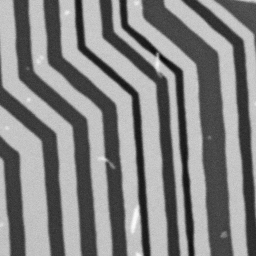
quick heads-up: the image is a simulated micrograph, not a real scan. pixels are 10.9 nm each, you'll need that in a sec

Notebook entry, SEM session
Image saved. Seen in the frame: groups of lines, slits or small figures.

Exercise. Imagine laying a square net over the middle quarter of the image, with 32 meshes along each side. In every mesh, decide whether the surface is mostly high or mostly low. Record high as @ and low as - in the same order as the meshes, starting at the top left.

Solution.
--@@@@@@---@@@@@@@----@@@---@@@@
----@@@@@---@@@@@@@----@@@@---@@
-----@@@@@---@@@@@@@----@@@---@@
------@@@@@@---@@@@@@-----@@--@@
@------@@@@@@---@@@@@@----@@--@@
@@------@@@@@@---@@@@@@---@@--@@
@@@------@@@@@@---@@@@@---@@--@@
@@@@------@@@@@@---@@@@---@@--@@
@@@@@@------@@@@@--@@@@---@@--@@
-@@@@@@-----@@@@@--@@@@---@@--@@
--@@@@@@-----@@@@--@@@@---@@--@@
---@@@@@@----@@@@--@@@@---@@--@@
----@@@@@----@@@@--@@@@@---@---@
-----@@@@-----@@@--@@@@@---@---@
@-----@@@-----@@@--@@@@@---@---@
@@----@@@@----@@@--@@@@@---@---@
@@----@@@@----@@@--@@@@@---@---@
@@----@@@@----@@@---@@@@---@@--@
@@----@@@@----@@@@--@@@@---@@--@
@@----@@@@----@@@@--@@@@---@@--@
@@-----@@@----@@@@--@@@@---@@--@
@@-----@@@----@@@@--@@@@---@@--@
@@-----@@@----@@@@--@@@@---@@--@
@@-----@@@----@@@@--@@@@---@@--@
@@@----@@@@---@@@@--@@@@---@@--@
@@@----@@@----@@@@--@@@@----@--@
@@@----@@@----@@@@--@@@@----@--@
@@@----@@@----@@@@--@@@@----@--@
@@@----@@@@----@@@--@@@@----@--@
@@@----@@@@----@@@--@@@@@---@---
@@@----@@@@----@@@---@@@@---@@--
@@@----@@@@----@@@---@@@@---@@--